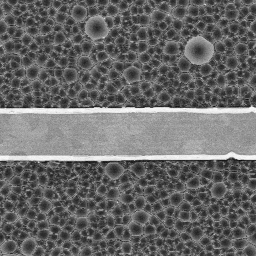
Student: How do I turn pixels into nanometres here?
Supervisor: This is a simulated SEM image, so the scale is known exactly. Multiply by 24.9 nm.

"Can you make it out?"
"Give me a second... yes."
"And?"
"one or a few lines or trenches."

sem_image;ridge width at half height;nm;1190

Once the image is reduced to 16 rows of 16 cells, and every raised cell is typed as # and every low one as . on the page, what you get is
................
................
................
............#...
................
................
................
################
################
################
................
................
................
................
................
................